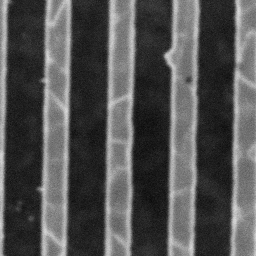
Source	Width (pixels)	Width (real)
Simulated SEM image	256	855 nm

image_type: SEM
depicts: one or a few lines or trenches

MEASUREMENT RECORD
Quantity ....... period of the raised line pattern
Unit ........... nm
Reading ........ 212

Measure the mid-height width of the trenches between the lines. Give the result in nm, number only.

133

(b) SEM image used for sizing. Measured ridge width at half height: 0.078 micrometres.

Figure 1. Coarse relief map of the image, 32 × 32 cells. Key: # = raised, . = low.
#.....###.....###.....###.....##
#.....###.....###.....###.....##
#.....###.....###.....###.....##
#.....###.....###.....###.....##
#.....###.....###.....###.....##
#.....###.....###.....###.....##
#.....###.....###....####.....##
#.....###.....###....###......##
#.....###.....###....####.....##
......##......###.....##.....###
#.....###.....##......##.....###
......##......##......##.....###
#.....##......##......###....###
#.....##......##......###....###
#.....##......##......##.....###
......##......##......##.....###
......##......##......##.....###
......##......##......##.....###
......##......##......##.....###
......##.....###.....###.....##.
......##.....###.....###.....###
......##......##.....###.....###
.....###.....###.....###.....###
.....###.....###.....###.....###
.....###.....###.....###.....###
.....###.....###.....###.....###
.....###.....###.....###.....#.#
.....###.....###.....###.....###
.....###.....###.....###.....###
.....###.....###.....###.....###
.....###.....###.....###.....###
.....###.....###.....###.....###